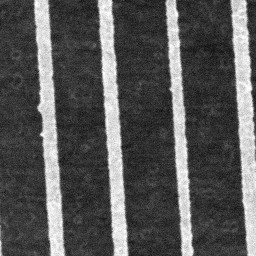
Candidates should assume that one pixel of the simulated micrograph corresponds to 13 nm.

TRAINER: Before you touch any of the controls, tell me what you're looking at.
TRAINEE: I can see one or a few lines or trenches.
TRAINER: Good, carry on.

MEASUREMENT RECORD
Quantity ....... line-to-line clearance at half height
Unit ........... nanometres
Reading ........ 714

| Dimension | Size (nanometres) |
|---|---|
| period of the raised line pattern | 850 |